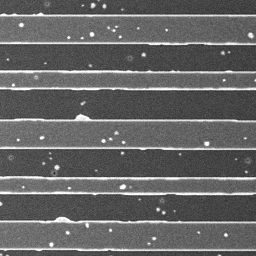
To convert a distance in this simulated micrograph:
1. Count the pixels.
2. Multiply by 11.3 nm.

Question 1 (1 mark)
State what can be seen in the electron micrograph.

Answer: lines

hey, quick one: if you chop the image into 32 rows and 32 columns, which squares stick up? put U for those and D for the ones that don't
DDDDDDDDDDDDDDDDDDDDDDDDDDDDDDDD
DDDDDDDDDDDDDDDDDDDDDDDDDDDDDDDD
UUUUUUUUUUUUUUUUUUUUUUUUUUUUUUUU
UUUUUUUUUUUUUUUUUUUUUUUUUUUUUUUU
UUUUUUUUUUUUUUUUUUUUUUUUUUUUUUUU
DDDDDDDDDDDDDDDDDDUUUUUUDUUUUUUU
DDDDDDDDDDDDDDDDDDDDDDDDDDDDDDDD
DDDDDDDDDDDDDDDDDDDDDDDDDDDDDDDD
DDDDDDDDDDDDDDDDDDDDDDDDDDDDDDDD
UUUUUUUUUUUUUUUUUUUUUUUUUUUUUUUU
UUUUUUUUUUUUUUUUUUUUUUUUUUUUUUUU
DDDDDDDDDDDDDDDDDDDDDDDDDDDDDDDD
DDDDDDDDDDDDDDDDDDDDDDDDDDDDDDDD
DDDDDDDDDDDDDDDDDDDDDDDDDDDDDDDD
DDDDDDDDDDDDDDDDDDDDDDDDDDDDDDDD
UUUUUUUUUUUUUUUUUUUUUUUUUUUUUUUU
UUUUUUUUUUUUUUUUUUUUUUUUUUUUUUUU
UUUUUUUUUUUUUUUUUUUUUUUUUUUUUUUU
UUUUUUUUUUUUUUUUUUUUUUUUUUUUUUUU
DDDDDDDDDDDDDDDDDDDDDDDDDDDDDDDD
DDDDDDDDDDDDDDDDDDDDDDDDDDDDDDDD
DDDDDDDDDDDDDDDDDDDDDDDDDDDDDDDD
UUUUUUUUUUUUUUUUUUUUUUUUUUUUUUUU
UUUUUUUUUUUUUUUUUUUUUUUUUUUUUUUU
DDDDDDDDDDDDDDDDDDDDDDDDDDDDDDDD
DDDDDDDDDDDDDDDDDDDDDDDDDDDDDDDD
DDDDDDDDDDDDDDDDDDDDDDDDDDDDDDDD
DDDDDDDUDDDDDDDDDDDDDDDDDDDDDDDD
UUUUUUUUUUUUUUUUUUUUUUUUUUUUUUUU
UUUUUUUUUUUUUUUUUUUUUUUUUUUUUUUU
UUUUUUUUUUUUUUUUUUUUUUUUUUUUUUUU
DDDDDDDDDDDDDDDDDDDDDDDDDDDDDDDD